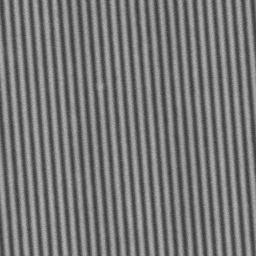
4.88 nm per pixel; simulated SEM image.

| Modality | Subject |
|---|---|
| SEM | parallel lines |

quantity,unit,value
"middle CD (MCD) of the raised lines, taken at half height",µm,0.0237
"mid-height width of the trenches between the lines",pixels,4.86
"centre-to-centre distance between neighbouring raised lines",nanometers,47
